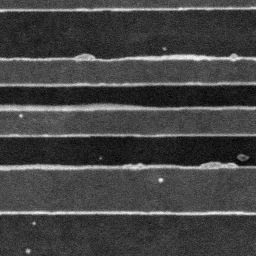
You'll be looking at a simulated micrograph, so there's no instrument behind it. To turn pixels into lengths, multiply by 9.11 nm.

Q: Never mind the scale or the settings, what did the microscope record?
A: lines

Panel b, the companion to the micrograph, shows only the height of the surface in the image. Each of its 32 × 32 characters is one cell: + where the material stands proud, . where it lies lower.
++++++++++++++++++++++++++++++++
................................
................................
................................
................................
................................
................................
++++++++++++...+++++++++++++++++
++++++++++++++++++++++++++++++++
++++++++++++++++++++++++++++++++
++++++++++++++++++..............
................................
................................
............+++.................
++++++++++++++++++++++++++++++++
++++++++++++++++++++++++++++++++
++++++++++++++++++++++++++++++++
................................
................................
................................
..........................+++...
++++++++++++++++++++++++++++++++
++++++++++++++++++++++++++++++++
++++++++++++++++++++++++++++++++
++++++++++++++++++++++++++++++++
++++++++++++++++++++++++++++++++
++.+++++++++.+++++++++++++++++++
................................
................................
................................
................................
................................